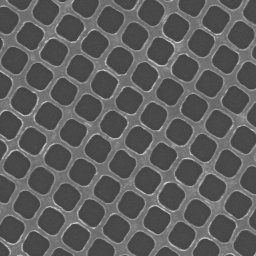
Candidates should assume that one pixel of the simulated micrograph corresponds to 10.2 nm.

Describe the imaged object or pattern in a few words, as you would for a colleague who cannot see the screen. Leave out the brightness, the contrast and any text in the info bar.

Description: a regular array of holes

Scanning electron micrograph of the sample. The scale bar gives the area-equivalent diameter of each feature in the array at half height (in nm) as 264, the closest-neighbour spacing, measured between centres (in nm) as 288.